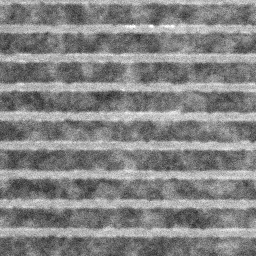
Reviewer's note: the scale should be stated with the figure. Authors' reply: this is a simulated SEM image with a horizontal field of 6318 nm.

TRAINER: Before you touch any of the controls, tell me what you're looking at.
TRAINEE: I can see parallel lines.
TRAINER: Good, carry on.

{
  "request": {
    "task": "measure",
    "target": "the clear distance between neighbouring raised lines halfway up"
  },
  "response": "0.148 µm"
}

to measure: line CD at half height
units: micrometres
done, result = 0.571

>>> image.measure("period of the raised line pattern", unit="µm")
0.719